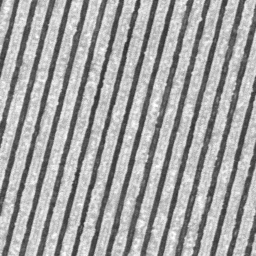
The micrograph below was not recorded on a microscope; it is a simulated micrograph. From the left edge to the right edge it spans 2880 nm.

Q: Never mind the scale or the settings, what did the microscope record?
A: parallel lines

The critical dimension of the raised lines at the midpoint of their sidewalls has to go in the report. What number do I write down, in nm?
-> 120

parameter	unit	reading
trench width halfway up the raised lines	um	0.0668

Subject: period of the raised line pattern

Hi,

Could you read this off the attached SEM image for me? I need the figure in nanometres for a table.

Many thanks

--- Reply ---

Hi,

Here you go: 189